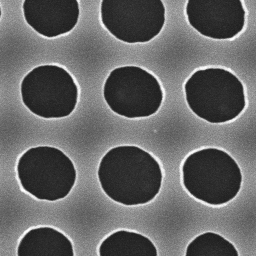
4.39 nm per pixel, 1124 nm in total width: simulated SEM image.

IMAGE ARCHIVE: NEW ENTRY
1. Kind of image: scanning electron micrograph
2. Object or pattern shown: holes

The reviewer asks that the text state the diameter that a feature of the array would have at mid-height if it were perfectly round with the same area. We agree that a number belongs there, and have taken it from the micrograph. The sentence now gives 249 nm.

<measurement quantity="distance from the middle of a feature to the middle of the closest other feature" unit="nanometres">356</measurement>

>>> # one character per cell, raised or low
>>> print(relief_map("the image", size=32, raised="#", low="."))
###.......###.......###.......##
###.......###........##........#
###.......###........###.......#
####.....####.......####......##
######.#######.....#######...###
################################
################################
################################
####....#######...##############
###......#####.....#####.....###
###......####.......###.......##
###.......###.......###.......##
###.......###.......###........#
###......#####......####......##
#####...#######....######.....##
################################
################################
################################
####...#######...###############
###.....#####......#####.....###
##.......####.......###.......##
##.......###........###.......##
##.......###........###.......##
###......####.......###.......##
####....######.....#####.....###
###############..#########..####
################################
################################
#####.##########################
###.....######....#######...####
##.......####......#####.....###
##.......###........###.......##